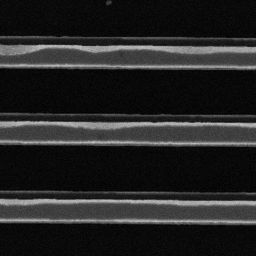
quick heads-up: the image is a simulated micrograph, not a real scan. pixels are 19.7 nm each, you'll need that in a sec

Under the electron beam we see lines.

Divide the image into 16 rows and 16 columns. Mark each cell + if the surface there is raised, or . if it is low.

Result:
................
................
++++++++++++++++
++++++++++++++++
................
................
................
++++++++++++++++
++++++++++++++++
................
................
................
++++++++++++++++
++++++++++++++++
................
................